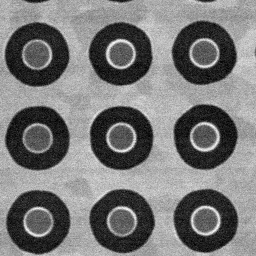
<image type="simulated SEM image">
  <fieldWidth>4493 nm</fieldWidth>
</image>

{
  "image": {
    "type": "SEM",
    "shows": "an array of small figures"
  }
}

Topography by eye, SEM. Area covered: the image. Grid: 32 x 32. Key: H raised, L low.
HHHHHHHHHHHHHHHHHHHHHHHHHHHHHHHH
HHHHHHHHHHHHHHHHHHHHHHHHHHHHHHHH
HHHHHHHHHHHHHHHHHHHHHHHHHHHHHHHH
HHLLLLLHHHHHHLLLLHHHHHHLLLLLHHHH
HLLLLLLLHHHHLLLLLLLHHHLLLLLLLHHH
HLLHHHLLHHHLLLHHLLLHHHLLHHHLLHHH
HLLHHHLLLHHLLHHHHLLHHLLLHHHLLLHH
HLLHHHLLLHHLLLHHHLLHHLLLHHHLLLHH
HLLLHLLLHHHHLLLLLLLHHHLLLLLLLHHH
HHLLLLLLHHHHLLLLLLHHHHHLLLLLHHHH
HHHLLLHHHHHHHHLLLHHHHHHHLLHHHHHH
HHHHHHHHHHHHHHHHHHHHHHHHHHHHHHHH
HHHHHHHHHHHHHHHHHHHHHHHHHHHHHHHH
HHHLLLHHHHHHHLLLLHHHHHHHLLLLHHHH
HHLLLLLLHHHHLLLLLLHHHHHLLLLLLHHH
HLLLLLLLHHHLLLLHLLLHHHLLLHLLLHHH
HLLHHHLLLHHLLLHHHLLHHHLLHHHLLLHH
HLLHHHLLLHHLLLHHHLLHHHLLHHHLLLHH
HLLHHHLLLHHLLLHHLLLHHHLLLHLLLHHH
HLLLLLLLHHHHLLLLLLLHHHLLLLLLLHHH
HHLLLLLHHHHHHLLLLLHHHHHLLLLLHHHH
HHHHHHHHHHHHHHHHHHHHHHHHHHHHHHHH
HHHHHHHHHHHHHHHHHHHHHHHHHHHHHHHH
HHHHHHHHHHHHHHHHHHHHHHHHHHHHHHHH
HHLLLLLHHHHHHLLLLLHHHHHLLLLLHHHH
HLLLLLLLHHHHLLLLLLLHHHLLLLLLLHHH
HLLLHHLLLHHLLLHHLLLHHHLLHHHLLLHH
HLLHHHLLLHHLLLHHHLLHHHLLHHHLLLHH
HLLHHHLLLHHLLLHHHLLHHHLLHHHLLLHH
HLLLLLLLHHHHLLLLLLLHHHLLLLLLLHHH
HHLLLLLLHHHHLLLLLLHHHHHLLLLLHHHH
HHHLLLHHHHHHHHLLLHHHHHHHHLLHHHHH